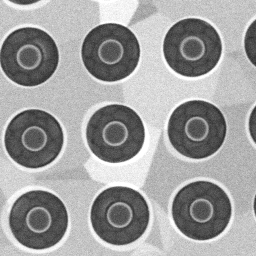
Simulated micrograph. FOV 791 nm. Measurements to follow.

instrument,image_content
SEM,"an array of small figures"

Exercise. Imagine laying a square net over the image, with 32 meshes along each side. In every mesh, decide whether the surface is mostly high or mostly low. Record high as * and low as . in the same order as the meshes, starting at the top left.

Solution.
*....***************************
********************************
***********************...******
**...*******....*****......****.
*.....*****......****......****.
.......***...**..***...**...**..
..***..***..***...**...**...***.
..***..***...**..****......****.
...*...****......****......*****
*.....******....*******..*******
**...***************************
********************************
************************.*******
************....******.....*****
**.....****......****.......***.
*.......***...*...***..***..***.
*..**...***..***..***..***..***.
...***..***..**...***.......***.
*..**...***.......***......*****
*......*****.....******...******
**....********.*****************
********************************
*************************.******
*************....*****......****
**.....*****......****.......***
*.......****..*....**...**...***
*...**..***...**...**...**...***
*..***...**...**...***..**...***
*...**...**........***......****
*.......****......*****....*****
**.....******....***************
********************************